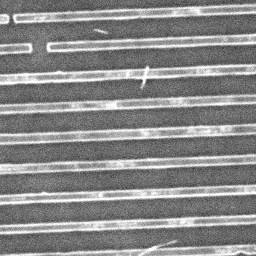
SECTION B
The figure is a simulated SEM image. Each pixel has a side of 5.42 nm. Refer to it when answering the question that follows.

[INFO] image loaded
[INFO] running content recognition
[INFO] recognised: parallel lines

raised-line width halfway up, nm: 42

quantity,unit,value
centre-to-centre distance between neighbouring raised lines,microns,0.163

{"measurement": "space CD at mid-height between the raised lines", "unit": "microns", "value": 0.119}